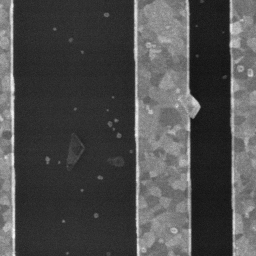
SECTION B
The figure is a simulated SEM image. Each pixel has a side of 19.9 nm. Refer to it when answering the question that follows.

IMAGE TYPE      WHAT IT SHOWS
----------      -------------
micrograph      lines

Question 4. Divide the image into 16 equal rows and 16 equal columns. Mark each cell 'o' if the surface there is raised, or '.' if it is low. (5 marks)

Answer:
o.......oooo..oo
o.......oooo..oo
o.......oooo..oo
o.......oooo..oo
o.......oooo..oo
o.......oooo...o
o........ooo...o
o........ooo...o
o........ooo...o
o........ooo...o
o........ooo...o
o........ooo...o
o........ooo...o
o........ooo...o
o........ooo...o
o........ooo...o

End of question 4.